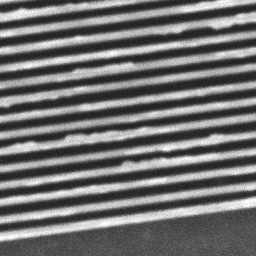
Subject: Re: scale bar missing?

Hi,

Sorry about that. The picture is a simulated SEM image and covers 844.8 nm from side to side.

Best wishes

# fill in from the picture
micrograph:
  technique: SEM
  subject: parallel lines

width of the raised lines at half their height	7.67	px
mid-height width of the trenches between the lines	28.6	nanometers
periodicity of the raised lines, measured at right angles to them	55	nanometres